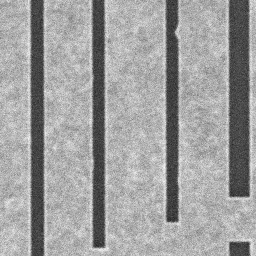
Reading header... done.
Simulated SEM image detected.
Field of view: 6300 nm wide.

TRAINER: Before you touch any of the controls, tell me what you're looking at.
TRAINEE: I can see one or a few lines or trenches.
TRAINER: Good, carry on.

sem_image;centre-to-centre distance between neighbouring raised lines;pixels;67.6